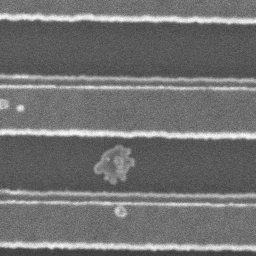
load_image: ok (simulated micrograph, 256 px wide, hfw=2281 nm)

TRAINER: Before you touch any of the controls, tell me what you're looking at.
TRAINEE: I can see lines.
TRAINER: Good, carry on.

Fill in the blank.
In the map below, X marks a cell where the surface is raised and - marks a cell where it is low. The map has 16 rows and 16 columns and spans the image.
XXXXXXXXXXXXXXXX
----------------
----------------
----------------
----------------
XXXXXXXXXXXXXXXX
XXXXXXXXXXXXXXXX
XXXXXXXXXXXXXXXX
-------XXXXXXXXX
----------------
----------------
----------------
XXXXXXXXXXXXXXXX
XXXXXXXXXXXXXXXX
XXXXXXXXXXXXXXXX
---XXXXXXXXXXXXX